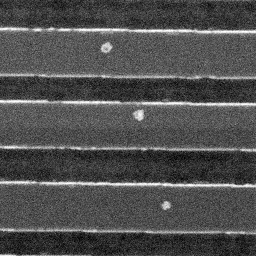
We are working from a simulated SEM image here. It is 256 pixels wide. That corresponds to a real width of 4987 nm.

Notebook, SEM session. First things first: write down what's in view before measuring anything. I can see lines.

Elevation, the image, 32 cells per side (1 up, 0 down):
00000000000000000000000000000000
00000000000000000000000000000000
00000000000000000000000000000000
00000000000000000000000000000000
11111111111111111111111111111111
11111111111111111111111111111111
11111111111111111111111111111111
11111111111111111111111111111111
11111111111111111111111111111111
00000000000001111111111111111111
00000000000000000000000000000000
00000000000000000000000000000000
00000000000000000000000000000000
11111111111111111111111111111111
11111111111111111111111111111111
11111111111111111111111111111111
11111111111111111111111111111111
11111111111111111111111111111111
00000001011111111111111111111111
00000000000000000000000000000000
00000000000000000000000000000000
00000000000000000000000000000000
00000000000000000000000000000000
11111111111111111111111111111111
11111111111111111111111111111111
11111111111111111111111111111111
11111111111111111111111111111111
11111111111111111111111111111111
11111111111111111111111111111111
00000000000000000000000000000000
00000000000000000000000000000000
00000000000000000000000000000000